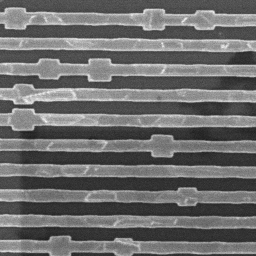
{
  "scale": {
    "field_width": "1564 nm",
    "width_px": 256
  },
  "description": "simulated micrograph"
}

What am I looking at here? wiring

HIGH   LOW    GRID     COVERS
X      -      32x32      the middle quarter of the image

XXXXXXXXXXXXXXXXXXXXXXXXXXXXXXXX
XXXXXXXXXXXXXXXXXXXXXXXXXXXXXXXX
XXXXXXXXXXXXXXXXXXXXXXXXXXXXXXXX
------XXXXXX--------------------
--------------------------------
--------------------------------
XXXXXXXXXXX---XXX------------XXX
XXXXXXXXXXXXXXXXXXXXXXXXXXXXXXXX
XXXXXXXXXXXXXXXXXXXXXXXXXXXXXXXX
--------------------------------
--------------------------------
--------------------------------
--------------------------------
XXXXXXXXXXXXXXXXXXXXXXXXXXXXXXXX
XXXXXXXXXXXXXXXXXXXXXXXXXXXXXXXX
-----------------XXXXXXXXXXXXXXX
--------------------------------
--------------------------------
----------------------XXXXX-----
XXXXXXXXXXXXXXXXXXXXXXXXXXXXXXXX
XXXXXXXXXXXXXXXXXXXXXXXXXXXXXXXX
XXXXXXXXXXXXXXXXXXXXXXXXXXXXXXXX
----------------------XXXXX-----
--------------------------------
--------------------------------
XXXXXXXXX------------XX---------
XXXXXXXXXXXXXXXXXXXXXXXXXXXXXXXX
XXXXXXXXXXXXXXXXXXXXXXXXXXXXXXXX
--------------------------------
--------------------------------
--------------------------------
----------------------------XXXX